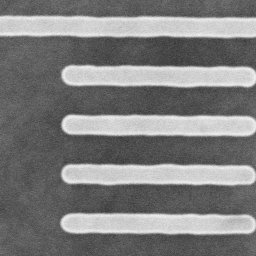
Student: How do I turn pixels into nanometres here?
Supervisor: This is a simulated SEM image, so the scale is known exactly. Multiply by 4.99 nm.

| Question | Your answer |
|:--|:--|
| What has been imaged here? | groups of lines, slits or small figures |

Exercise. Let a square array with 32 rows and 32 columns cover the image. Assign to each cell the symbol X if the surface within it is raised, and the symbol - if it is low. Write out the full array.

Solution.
--------------------------------
--------------------------------
XXXXXXXXXXXXXXXXXXXXXXXXXXXXXXXX
XXXXXXXXXXXXXXXXXXXXXXXXXXXXXXXX
--------------XX-XX---XXX-XXXXXX
--------------------------------
--------------------------------
--------------------------------
--------XXXXXXXXXXXXXXXXXXXXXXX-
--------XXXXXXXXXXXXXXXXXXXXXXXX
---------XXXXXXXXXXXXXXXXXXXXXXX
--------------------------------
--------------------------------
--------------------------------
---------X------XX--------------
--------XXXXXXXXXXXXXXXXXXXXXXXX
--------XXXXXXXXXXXXXXXXXXXXXXXX
--------------------------------
--------------------------------
--------------------------------
--------------------------------
--------XXXXXXXXXXXXXXXXXXXXXXXX
--------XXXXXXXXXXXXXXXXXXXXXXXX
--------------------------------
--------------------------------
--------------------------------
--------------------------------
--------XXXXXXXXXXXXXXXXXXXXXXXX
--------XXXXXXXXXXXXXXXXXXXXXXXX
--------------------------------
--------------------------------
--------------------------------